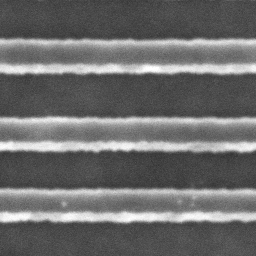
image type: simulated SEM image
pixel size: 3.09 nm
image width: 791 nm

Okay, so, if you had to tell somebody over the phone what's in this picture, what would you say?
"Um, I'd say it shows lines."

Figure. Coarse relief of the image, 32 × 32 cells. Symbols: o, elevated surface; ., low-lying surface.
................................
................................
................................
................................
................................
oooooooooooooooooooooooooooooooo
oooooooooooooooooooooooooooooooo
oooooooooooooooooooooooooooooooo
oooooooooooooooooooooooooooooooo
................................
................................
................................
................................
................................
................................
oooooooooooooooooooooooooooooooo
oooooooooooooooooooooooooooooooo
oooooooooooooooooooooooooooooooo
oooooooooooooooooooooooooooooooo
................................
................................
................................
................................
................................
oooooooooooooooooooooooooooooooo
oooooooooooooooooooooooooooooooo
oooooooooooooooooooooooooooooooo
oo.....oo..oo.ooooo.ooo....o..o.
................................
................................
................................
................................